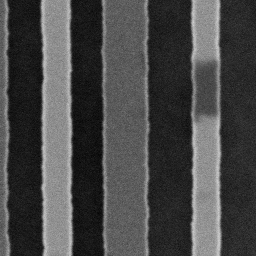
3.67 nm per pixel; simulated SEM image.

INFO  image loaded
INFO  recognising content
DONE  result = lines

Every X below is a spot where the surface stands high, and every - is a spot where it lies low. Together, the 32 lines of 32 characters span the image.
X----XXXX----XXXXX------XXX-----
X----XXXX----XXXXX------XXX-----
X----XXXX----XXXXXX-----XXX-----
X----XXXX----XXXXX------XXX-----
X----XXXX----XXXXX------XXX-----
X----XXXX----XXXXX------XXX-----
X----XXXX----XXXXX------XXX-----
X----XXXX----XXXXX------XXX-----
X----XXXX----XXXXX------XXX-----
X----XXXX----XXXXX------XXX-----
X----XXXX----XXXXX------XXX-----
X----XXXX----XXXXX------XXX-----
X----XXXX----XXXXX------XXX-----
X----XXXX----XXXXX------XXX-----
X----XXXX----XXXXX------XXX-----
X----XXXX----XXXXXX-----XXX-----
X----XXXX----XXXXXX-----XXX-----
X----XXXX----XXXXX------XXX-----
X----XXXX----XXXXX------XXXX----
X----XXXX----XXXXX------XXXX----
X----XXXX----XXXXX------XXX-----
X----XXXX----XXXXX------XXX-----
X----XXXX----XXXXX------XXX-----
X----XXXX----XXXXX------XXX-----
X----XXXX----XXXXX------XXX-----
X----XXXX----XXXXX------XXX-----
X----XXXX----XXXXXX-----XXXX----
X----XXXX----XXXXX------XXXX----
X----XXXX----XXXXX------XXXX----
X----XXXX----XXXXX------XXXX----
X----XXXX----XXXXX------XXXX----
X----XXXX----XXXXX------XXX-----